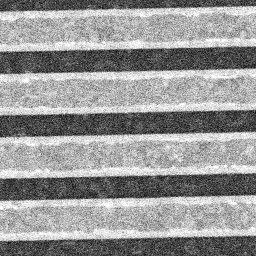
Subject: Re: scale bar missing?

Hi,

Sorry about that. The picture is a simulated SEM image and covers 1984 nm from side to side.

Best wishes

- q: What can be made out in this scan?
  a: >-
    one or a few lines or trenches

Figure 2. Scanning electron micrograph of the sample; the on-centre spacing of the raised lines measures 489 nanometers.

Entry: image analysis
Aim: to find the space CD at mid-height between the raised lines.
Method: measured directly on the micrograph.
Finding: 214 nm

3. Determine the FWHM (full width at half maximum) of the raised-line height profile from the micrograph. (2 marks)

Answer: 270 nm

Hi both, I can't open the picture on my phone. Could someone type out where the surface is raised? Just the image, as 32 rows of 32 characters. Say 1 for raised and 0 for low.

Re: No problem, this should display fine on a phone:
00000000000000000000000000000000
00000000000000000111111111111111
11111111111111111111111111111111
11111111111111111111111111111111
11111111111111111111111111111111
11111111111111111111111110000000
00000000000000000000000000000000
00000000000000000000000000000000
00000000000000000000000000000000
00000001111111111111111111111111
11111111111111111111111111111111
11111111111111111111111111111111
11111111111111111111111111111111
11111111111111111111111110000000
00000000000000000000000000000000
00000000000000000000000000000000
00000000000000000000000000000000
00011111111111111111111111111111
11111111111111111111111111111111
11111111111111111111111111111111
11111111111111111111111111111111
11111111111111111111100000000000
00000000000000000000000000000000
00000000000000000000000000000000
00000000000000000000000000000000
10000111111111111111111111111111
11111111111111111111111111111111
11111111111111111111111111111111
11111111111111111111111111111111
11111111111000000000000000000000
00000000000000000000000000000000
00000000000000000000000000000000